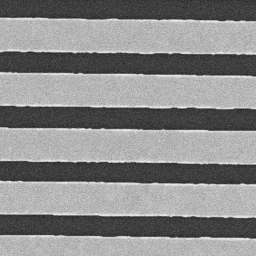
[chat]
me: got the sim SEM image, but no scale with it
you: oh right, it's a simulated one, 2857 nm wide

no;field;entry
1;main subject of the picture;lines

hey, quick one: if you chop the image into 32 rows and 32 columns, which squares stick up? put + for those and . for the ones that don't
................................
................................
+++++++++++..++.................
++++++++++++++++++++++++++++++++
++++++++++++++++++++++++++++++++
++++++++++++++++++++++++++++++++
.........+.+++++++++++++++++++++
................................
................................
+++++++++++++++++++++++.........
++++++++++++++++++++++++++++++++
++++++++++++++++++++++++++++++++
++++++++++++++++++++++++++++++++
...........................++..+
................................
................................
++++++++++++++++++++++++++++++++
++++++++++++++++++++++++++++++++
++++++++++++++++++++++++++++++++
++++++++++++++++++++++++++++++++
................................
................................
................................
++++++++++++++++++++++++++++++++
++++++++++++++++++++++++++++++++
++++++++++++++++++++++++++++++++
++++++++++++++++++++++++++++++++
................................
................................
++++++++........................
++++++++++++++++++++++++++++++++
++++++++++++++++++++++++++++++++